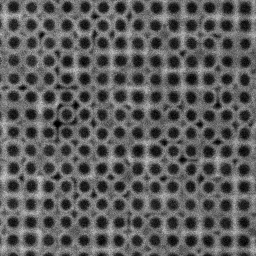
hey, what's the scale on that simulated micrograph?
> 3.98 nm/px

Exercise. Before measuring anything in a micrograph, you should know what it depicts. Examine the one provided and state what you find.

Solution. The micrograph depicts a regular array of holes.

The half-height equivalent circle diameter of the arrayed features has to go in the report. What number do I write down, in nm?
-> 47.3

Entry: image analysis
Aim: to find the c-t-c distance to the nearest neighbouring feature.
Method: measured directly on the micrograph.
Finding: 68.2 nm